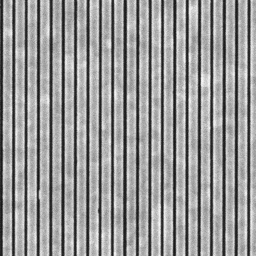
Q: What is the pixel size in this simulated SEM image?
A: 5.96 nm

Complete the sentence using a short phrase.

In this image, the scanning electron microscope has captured parallel lines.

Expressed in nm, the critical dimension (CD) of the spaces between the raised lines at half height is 22.3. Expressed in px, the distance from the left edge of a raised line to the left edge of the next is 12.4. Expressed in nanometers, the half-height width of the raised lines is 49.9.